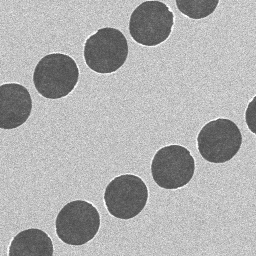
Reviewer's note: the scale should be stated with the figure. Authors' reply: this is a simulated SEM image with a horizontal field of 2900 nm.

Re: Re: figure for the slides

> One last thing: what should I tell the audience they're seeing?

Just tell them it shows holes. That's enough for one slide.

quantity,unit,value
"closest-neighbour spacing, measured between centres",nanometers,624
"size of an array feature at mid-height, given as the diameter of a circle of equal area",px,44.4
